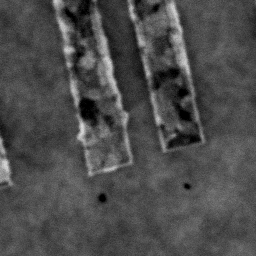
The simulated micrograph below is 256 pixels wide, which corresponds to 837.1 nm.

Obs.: one or a few lines or trenches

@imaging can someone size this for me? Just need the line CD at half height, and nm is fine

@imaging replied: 135